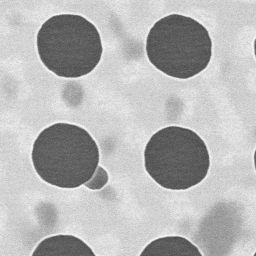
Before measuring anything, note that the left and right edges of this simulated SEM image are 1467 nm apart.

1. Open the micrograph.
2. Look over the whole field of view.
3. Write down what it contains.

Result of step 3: holes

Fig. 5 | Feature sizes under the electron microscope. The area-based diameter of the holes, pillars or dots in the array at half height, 372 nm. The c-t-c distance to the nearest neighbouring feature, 624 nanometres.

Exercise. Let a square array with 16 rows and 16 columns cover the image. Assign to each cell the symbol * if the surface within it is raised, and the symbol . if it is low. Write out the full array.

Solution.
****************
***...****...***
**....***....***
**....***....***
***...****..****
****************
****************
****************
**....****..****
**....***....***
**....***....***
***....***..****
****************
****************
****************
**....***...****